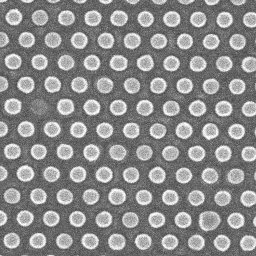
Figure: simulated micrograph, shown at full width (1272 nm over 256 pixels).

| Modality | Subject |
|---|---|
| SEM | a regular array of raised bodies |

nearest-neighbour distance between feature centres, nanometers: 127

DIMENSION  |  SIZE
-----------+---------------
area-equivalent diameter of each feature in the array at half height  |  78.1 nanometers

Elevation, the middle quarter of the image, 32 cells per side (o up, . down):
oo...oooo...oooo...ooo...oooo...
.............oo.....o.....oo....
................................
................................
..oooo...ooo...oooo...ooo....ooo
..oooo...ooo...oooo...oooo..oooo
...oo....ooo....ooo...ooo....ooo
................................
................................
oo....oo....ooo....ooo....oo....
oo...oooo...ooo...oooo...oooo..o
oo...oooo...ooo...oooo...oooo..o
o.....o......oo....oo....ooo....
................................
................................
..ooo...oooo...ooo....ooo...oooo
..ooo...oooo...oooo...ooo...oooo
..ooo....ooo...oooo...ooo...oooo
.......................o.....oo.
................................
oo....oo....oo..................
oo...oooo...ooo...oooo...ooo...o
oo...oooo...ooo...oooo...ooo...o
o....ooo....ooo....oo....ooo....
................................
................................
..ooo....ooo...ooo....ooo....oo.
..ooo...oooo...oooo..oooo...oooo
..ooo...oooo...oooo..oooo...oooo
.........oo......o....oo.....oo.
................................
......o.....ooo.................